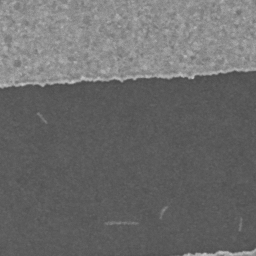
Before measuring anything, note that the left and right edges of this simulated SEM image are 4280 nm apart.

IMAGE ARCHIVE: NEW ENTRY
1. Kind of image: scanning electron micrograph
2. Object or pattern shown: one or a few lines or trenches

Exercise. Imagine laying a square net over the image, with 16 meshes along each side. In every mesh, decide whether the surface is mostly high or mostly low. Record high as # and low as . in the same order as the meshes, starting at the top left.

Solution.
################
################
################
################
##############..
................
................
................
................
................
................
................
................
................
................
................